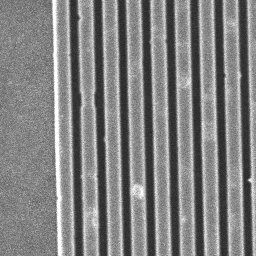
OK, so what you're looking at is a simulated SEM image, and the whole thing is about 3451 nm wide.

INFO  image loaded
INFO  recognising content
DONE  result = parallel lines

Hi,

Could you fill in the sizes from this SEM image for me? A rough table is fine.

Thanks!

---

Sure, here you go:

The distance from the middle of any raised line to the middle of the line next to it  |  0.326 micrometres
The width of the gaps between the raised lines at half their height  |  0.12 µm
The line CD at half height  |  212 nanometers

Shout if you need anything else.